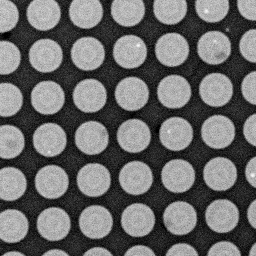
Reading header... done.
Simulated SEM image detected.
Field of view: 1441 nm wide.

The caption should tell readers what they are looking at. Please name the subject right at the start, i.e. an array of small figures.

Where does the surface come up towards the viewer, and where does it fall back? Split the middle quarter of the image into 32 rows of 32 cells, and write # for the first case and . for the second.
...######.....#####.......##....
.....#..........................
................................
................##.......#####..
....#####.....######....#######.
...#######...########...#######.
...#######...########..#########
..########...########..#########
..#########..########...#######.
...#######...########...#######.
...#######....######.....#####..
....#####.......##..............
................................
...........................##...
......##.......#####.....######.
....######....#######...########
...########...#######...########
...########..#########..########
...########..#########..########
#..########...#######...########
...########...#######....######.
....######.....#####.......##...
......##........................
................................
.................##.......#####.
.....#####.....######....#######
....#######...########...#######
#...#######...########..########
#..#########..########..########
#..#########..########...#######
#...#######...########...#######
#...#######....######.....#####.